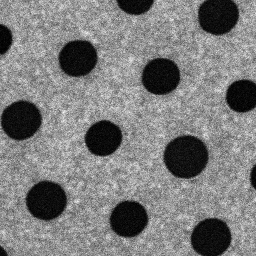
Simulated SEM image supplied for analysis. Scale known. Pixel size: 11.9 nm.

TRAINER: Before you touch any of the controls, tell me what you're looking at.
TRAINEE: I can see holes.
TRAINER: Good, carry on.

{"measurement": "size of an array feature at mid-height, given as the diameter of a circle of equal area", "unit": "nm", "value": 458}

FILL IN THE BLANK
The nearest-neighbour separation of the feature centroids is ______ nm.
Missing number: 1010